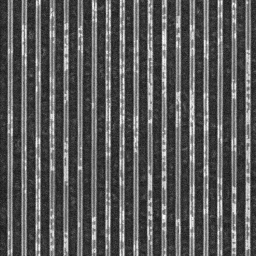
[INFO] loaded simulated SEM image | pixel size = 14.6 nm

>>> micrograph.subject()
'parallel lines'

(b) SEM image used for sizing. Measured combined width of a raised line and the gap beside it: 0.204 micrometres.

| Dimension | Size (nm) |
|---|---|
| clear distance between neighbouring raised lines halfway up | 144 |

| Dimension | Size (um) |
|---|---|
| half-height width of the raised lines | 0.0583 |